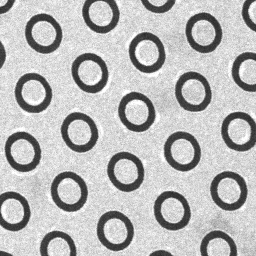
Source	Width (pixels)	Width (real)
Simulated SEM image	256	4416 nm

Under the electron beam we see a regular array of ring-shaped grooves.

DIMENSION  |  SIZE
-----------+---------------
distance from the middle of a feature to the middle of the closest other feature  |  1.03 microns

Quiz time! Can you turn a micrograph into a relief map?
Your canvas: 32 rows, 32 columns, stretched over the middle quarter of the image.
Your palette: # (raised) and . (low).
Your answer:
##..#####..######........#######
##..#####..########.....########
##..#####..###################..
##..#####..##################...
###..###...#################...#
###.......##################..##
####.....###################..##
#######.########....########..##
##############.......#######..##
##############...###..######...#
##############..#####..######...
#############..######..#######..
#....########..######..#########
.......#######..#####..#########
..###...######...###...#########
.#####..#######.......##########
.#####...#######.....###########
.######..##################.....
..#####..#################......
..####..#################...###.
#.......#################..#####
##.....##################..#####
#############....########..#####
############.......######..#####
###########..####..#######..###.
###########..#####..#######.....
###########..#####..########....
...########..#####..############
.....######..#####..############
###..#######..###...############
####..######.......#############
####..########....##############